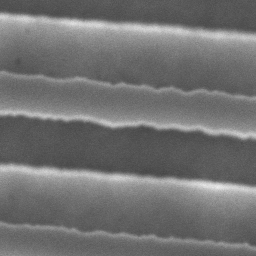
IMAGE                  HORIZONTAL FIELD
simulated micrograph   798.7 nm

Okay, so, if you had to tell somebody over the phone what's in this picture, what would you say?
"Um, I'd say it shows lines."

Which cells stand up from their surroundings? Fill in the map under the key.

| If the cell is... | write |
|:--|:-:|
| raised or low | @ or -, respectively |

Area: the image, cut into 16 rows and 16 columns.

----------------
@@@@@@----------
@@@@@@@@@@@@@@@@
@@@@@@@@@@@@@@@@
@@@@@@@@@@@@@@@@
@@@@@@@@@@@@@@@@
@@@@@@@@@@@@@@@@
------@@@@@@@@@@
----------------
----------------
@---------------
@@@@@@@@@@@@@---
@@@@@@@@@@@@@@@@
@@@@@@@@@@@@@@@@
@@@@@@@@@@@@@@@@
@@@@@@@@@@@@@@@@